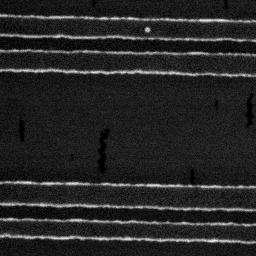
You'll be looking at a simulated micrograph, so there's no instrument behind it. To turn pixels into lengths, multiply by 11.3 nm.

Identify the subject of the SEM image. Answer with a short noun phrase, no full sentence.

lines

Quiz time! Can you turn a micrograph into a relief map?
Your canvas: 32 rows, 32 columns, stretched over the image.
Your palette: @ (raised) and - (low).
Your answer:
--------------------------------
--------------------------------
@@@@@@@@@@@@@@@@@@@@@@----------
@@@@@@@@@@@@@@@@@@@@@@@@@@@@@@@@
--@@@@@@@@@@@@@@@@@@@@@@@@@@@@@@
--------------------------------
@@@@@@@@-@@@@-------------------
@@@@@@@@@@@@@@@@@@@@@@@@@@@@@@@@
@@@@@@@@@@@@@@@@@@@@@@@@@@@@@@@@
--------------------------------
--------------------------------
--------------------------------
--------------------------------
--------------------------------
--------------------------------
--------------------------------
--------------------------------
--------------------------------
--------------------------------
--------------------------------
--------------------------------
--------------------------------
--------------------------------
@@@@@@@@@@@@@@@@@@@@@@@@@@@@@@@@
@@@@@@@@@@@@@@@@@@@@@@@@@@@@@@@@
@@@@@@@@@@@@@@@@@@@@@@@@@@@@@@@@
--------------------------------
@@@@@---------------------------
@@@@@@@@@@@@@@@@@@@@@@@@@@@@@@@@
@@@@@@@@@@@@@@@@@@@@@@@@@@@@@@@@
--------------------------------
--------------------------------